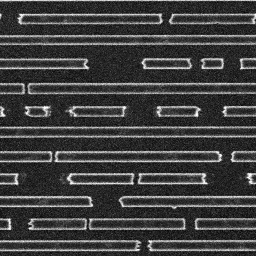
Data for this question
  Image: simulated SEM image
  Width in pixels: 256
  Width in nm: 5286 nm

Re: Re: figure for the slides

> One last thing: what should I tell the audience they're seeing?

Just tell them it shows parallel lines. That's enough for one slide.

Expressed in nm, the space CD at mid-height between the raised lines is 263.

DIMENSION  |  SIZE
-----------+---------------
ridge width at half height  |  204 nanometres